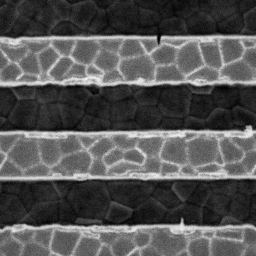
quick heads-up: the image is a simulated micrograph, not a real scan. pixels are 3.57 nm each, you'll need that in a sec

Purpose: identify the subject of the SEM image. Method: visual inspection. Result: one or a few lines or trenches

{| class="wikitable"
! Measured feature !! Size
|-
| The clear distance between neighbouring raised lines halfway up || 174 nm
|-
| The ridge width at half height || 0.162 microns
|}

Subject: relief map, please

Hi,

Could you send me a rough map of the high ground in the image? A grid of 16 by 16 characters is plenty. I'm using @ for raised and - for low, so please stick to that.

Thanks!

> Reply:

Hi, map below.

----------------
----------------
@@@@@@@@@@@@@@@@
@@@@@@@@@@@@@@@@
@@@@@@@@@@@@@@@@
----------------
----------------
----------------
@@@@@@@@@@@@@@@@
@@@@@@@@@@@@@@@@
@@@@@@@@@@@@@@@@
----------------
----------------
----------------
@@@@@@@@@@@@@@@@
@@@@@@@@@@@@@@@@